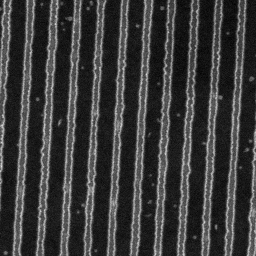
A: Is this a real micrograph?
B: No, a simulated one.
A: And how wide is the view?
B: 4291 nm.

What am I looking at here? parallel lines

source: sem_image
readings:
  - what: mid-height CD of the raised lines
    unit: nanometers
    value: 310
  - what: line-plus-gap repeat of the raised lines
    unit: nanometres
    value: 393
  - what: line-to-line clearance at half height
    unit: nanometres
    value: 87.8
